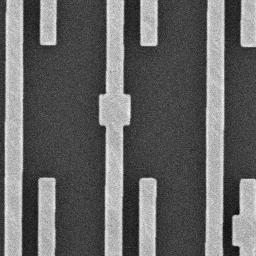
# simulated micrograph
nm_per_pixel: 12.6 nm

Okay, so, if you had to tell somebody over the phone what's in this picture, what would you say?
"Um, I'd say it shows wiring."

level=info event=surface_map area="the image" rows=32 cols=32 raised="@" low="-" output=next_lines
-@@--@@------@@---@@------@@--@@
-@@--@@------@@---@@------@@--@@
-@@--@@------@@---@@------@@--@@
-@@--@@------@@---@@------@@--@@
-@@--@@------@@---@@------@@--@@
-@@--@@------@@---@-------@@--@@
-@@----------@@-----------@@----
-@@----------@@-----------@@----
-@@----------@@-----------@@----
-@@----------@@-----------@@----
-@@----------@@-----------@@----
-@@----------@@@----------@@----
-@@---------@@@@----------@@----
-@@---------@@@@----------@@----
-@@---------@@@@----------@@----
-@@----------@@@----------@@----
-@@----------@@-----------@@----
-@@----------@@-----------@@----
-@@----------@@-----------@@----
-@@----------@@-----------@@----
-@@----------@@-----------@@----
-@@----------@@-----------@@----
-@@--@@------@@---@-------@@----
-@@--@@------@@--@@-------@@--@@
-@@--@@------@@--@@-------@@--@@
-@@--@@------@@--@@-------@@--@@
-@@--@@------@@--@@-------@@--@@
-@@--@@------@@--@@-------@@-@@@
-@@--@@------@@--@@-------@@-@@@
-@@--@@------@@--@@-------@@-@@@
-@@--@@------@@--@@-------@@-@@@
-@@--@@------@@--@@-------@@--@@